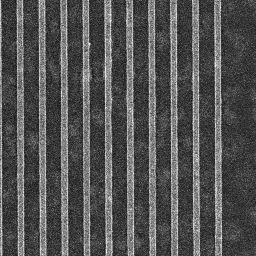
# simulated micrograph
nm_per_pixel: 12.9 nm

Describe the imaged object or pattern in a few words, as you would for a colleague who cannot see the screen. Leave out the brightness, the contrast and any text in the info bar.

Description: parallel lines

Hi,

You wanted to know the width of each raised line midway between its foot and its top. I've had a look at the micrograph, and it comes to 75.6 nm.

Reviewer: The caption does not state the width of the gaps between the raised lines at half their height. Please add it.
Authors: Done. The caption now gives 204 nm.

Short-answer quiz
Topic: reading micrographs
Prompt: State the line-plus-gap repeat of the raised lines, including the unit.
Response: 22 px